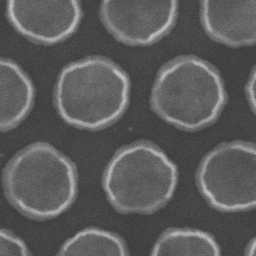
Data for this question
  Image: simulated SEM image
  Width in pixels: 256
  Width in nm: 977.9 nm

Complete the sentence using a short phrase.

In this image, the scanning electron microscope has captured raised bodies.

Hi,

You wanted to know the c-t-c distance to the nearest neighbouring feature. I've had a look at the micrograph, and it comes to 372 nanometers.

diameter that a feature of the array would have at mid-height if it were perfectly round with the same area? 271 nanometers